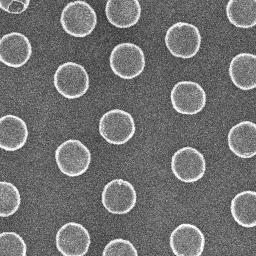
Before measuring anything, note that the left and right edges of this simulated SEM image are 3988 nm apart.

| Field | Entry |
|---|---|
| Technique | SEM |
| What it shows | a regular array of raised bodies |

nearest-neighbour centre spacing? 921 nm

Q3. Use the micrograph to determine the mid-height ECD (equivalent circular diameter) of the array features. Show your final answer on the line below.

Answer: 526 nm